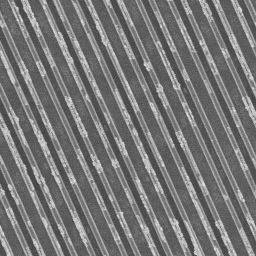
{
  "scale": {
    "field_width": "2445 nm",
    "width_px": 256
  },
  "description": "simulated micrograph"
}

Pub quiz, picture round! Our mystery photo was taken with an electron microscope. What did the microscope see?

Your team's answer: parallel lines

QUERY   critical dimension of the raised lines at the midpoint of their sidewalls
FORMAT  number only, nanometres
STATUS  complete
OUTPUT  52.3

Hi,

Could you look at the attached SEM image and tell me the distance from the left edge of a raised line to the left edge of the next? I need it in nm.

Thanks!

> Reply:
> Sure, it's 139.